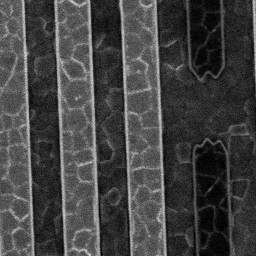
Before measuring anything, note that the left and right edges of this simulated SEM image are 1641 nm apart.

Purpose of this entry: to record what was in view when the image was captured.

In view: one or a few lines or trenches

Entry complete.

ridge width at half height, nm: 218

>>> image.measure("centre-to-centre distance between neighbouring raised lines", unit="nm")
423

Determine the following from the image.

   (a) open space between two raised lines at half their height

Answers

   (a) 206 nanometers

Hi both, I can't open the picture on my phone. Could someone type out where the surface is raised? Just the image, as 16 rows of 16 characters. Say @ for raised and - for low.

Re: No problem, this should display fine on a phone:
@--@@@--@@--@@--
@---@@--@@--@@--
@@--@@--@@--@@--
@@--@@--@@--@@--
@@--@@--@@--@@--
@@--@@--@@------
@@--@@--@@------
@@--@@--@@------
@@--@@--@@------
@@--@@--@@--@@--
@@--@@--@@--@@--
@@--@@--@@--@@--
@@--@@--@@--@@--
@@--@@--@@--@@--
@@--@@--@@--@@--
@@--@@--@@--@@--